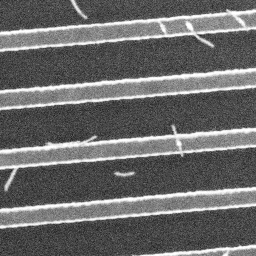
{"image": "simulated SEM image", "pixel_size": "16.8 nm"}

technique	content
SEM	lines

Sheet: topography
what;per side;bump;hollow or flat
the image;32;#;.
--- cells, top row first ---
................................
...............................#
...................#############
........########################
######################..........
#########.......................
................................
................................
................................
......................##########
...........#####################
#########################.......
############....................
#...............................
................................
................................
...........................#####
...............#################
.....#########################..
#################...............
######..........................
................................
................................
................................
....................############
..........######################
#######################.........
###########.....................
................................
................................
................................
........................########